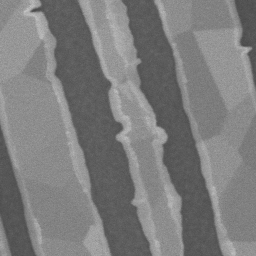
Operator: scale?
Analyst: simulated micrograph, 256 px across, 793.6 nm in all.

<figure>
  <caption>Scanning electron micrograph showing one or a few lines or trenches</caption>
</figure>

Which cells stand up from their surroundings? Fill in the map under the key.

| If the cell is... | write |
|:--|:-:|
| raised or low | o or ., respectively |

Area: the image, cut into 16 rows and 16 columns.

oo...oo...ooooo.
ooo...o...ooooo.
ooo...oo...oooo.
ooo...oo...oooo.
ooo....o...ooooo
oooo...oo..ooooo
oooo...oo...oooo
oooo....oo..oooo
ooooo...oo..oooo
.oooo...oo...ooo
.oooo...oo...ooo
.oooo....o...ooo
..oooo...oo..ooo
..oooo...oo...oo
..oooo...oo...oo
..ooooo...o...oo